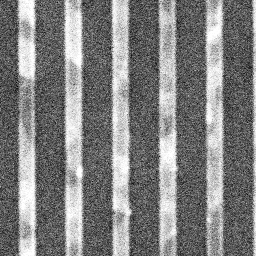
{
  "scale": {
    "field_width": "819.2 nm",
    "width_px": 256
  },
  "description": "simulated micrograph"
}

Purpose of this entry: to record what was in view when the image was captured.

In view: parallel lines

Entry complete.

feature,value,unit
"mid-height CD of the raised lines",0.0444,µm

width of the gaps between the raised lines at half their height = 0.107 micrometres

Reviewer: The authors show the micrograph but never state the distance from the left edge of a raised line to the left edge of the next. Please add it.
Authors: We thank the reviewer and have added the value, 150 nanometers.